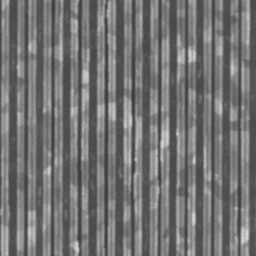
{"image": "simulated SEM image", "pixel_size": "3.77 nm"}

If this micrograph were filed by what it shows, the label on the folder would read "parallel lines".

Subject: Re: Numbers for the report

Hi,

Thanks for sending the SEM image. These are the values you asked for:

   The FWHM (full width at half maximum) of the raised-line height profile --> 23.5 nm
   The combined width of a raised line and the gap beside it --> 50.2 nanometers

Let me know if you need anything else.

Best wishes